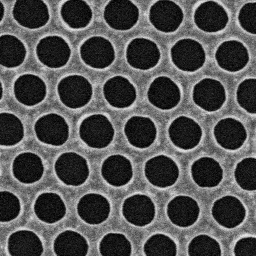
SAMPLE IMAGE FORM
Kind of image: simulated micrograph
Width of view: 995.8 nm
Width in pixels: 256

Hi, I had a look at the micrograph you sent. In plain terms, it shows a regular array of holes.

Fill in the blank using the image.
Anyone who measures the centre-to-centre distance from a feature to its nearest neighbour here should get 44.2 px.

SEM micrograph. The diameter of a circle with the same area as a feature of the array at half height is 129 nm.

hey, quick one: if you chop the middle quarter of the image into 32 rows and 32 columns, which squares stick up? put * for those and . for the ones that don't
******.....******......*****....
********************.********...
********************************
......******....*******...******
......****.......*****......****
.......***........***.......****
.......***........***........***
.......***........***........***
.......***........***........***
......*****.......***........***
*....*******.....*****......****
*************************.******
********.***********************
*****......******....*******....
.***........****......*****.....
.***........***........***......
.***.........**........***......
.***.........**........***......
.***........****.......***......
*****.......****......*****.....
******.....******....*******....
******************************.*
...*****************************
.....*****......******.....*****
......****.......****.......****
......***........***........****
......***........***.........***
......***........***.........***
......****.......***........****
.....******.....*****.......****
**..********...*******.....*****
********************************